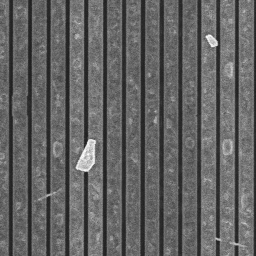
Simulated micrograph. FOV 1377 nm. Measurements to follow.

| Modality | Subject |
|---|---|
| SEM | parallel lines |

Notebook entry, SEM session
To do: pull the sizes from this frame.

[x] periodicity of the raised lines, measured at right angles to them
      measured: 101 nm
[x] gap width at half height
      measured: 0.0249 microns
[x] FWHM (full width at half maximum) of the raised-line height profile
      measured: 0.0767 um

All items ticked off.